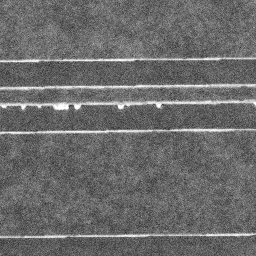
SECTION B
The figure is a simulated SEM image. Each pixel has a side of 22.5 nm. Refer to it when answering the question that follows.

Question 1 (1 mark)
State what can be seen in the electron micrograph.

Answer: lines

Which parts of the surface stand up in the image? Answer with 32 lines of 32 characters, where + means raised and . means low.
++++++++++++++++++++++++++++++++
++++++++++++++++++++++++++++++++
++++++++++++++++++++++++++++++++
++++++++++++++++++++++++++++++++
++++++++++++++++++++++++++++++++
++++++++++++++++++++++++++++++++
++++++++++++++++++++++++++++++++
+++++++++++++++++...............
................................
................................
................................
++++++++++++++++++++++++++++++++
++++++++++++++++++++++++++++++++
................................
................................
................................
.......+++++++++++++++++++++++++
++++++++++++++++++++++++++++++++
++++++++++++++++++++++++++++++++
++++++++++++++++++++++++++++++++
++++++++++++++++++++++++++++++++
++++++++++++++++++++++++++++++++
++++++++++++++++++++++++++++++++
++++++++++++++++++++++++++++++++
++++++++++++++++++++++++++++++++
++++++++++++++++++++++++++++++++
++++++++++++++++++++++++++++++++
++++++++++++++++++++++++++++++++
++++++++++++++++++++++++++++++++
++++++++........................
................................
................................